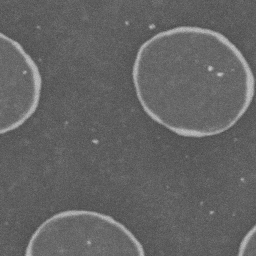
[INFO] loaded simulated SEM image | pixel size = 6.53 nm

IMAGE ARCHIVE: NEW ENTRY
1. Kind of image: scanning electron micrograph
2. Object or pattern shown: raised bodies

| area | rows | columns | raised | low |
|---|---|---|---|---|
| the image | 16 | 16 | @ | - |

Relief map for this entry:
----------------
----------------
@--------@@@@@--
@@-------@@@@@@-
@@------@@@@@@@@
@@-------@@@@@@@
@@-------@@@@@@-
@---------@@@@@-
----------------
----------------
----------------
----------------
----------------
----@@----------
--@@@@@@--------
--@@@@@@@------@